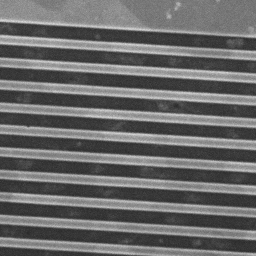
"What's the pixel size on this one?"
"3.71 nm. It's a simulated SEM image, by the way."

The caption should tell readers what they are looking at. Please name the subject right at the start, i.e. parallel lines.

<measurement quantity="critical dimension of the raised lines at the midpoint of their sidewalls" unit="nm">29.6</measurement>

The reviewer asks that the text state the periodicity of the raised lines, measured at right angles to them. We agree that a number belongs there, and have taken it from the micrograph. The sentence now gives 83.1 nm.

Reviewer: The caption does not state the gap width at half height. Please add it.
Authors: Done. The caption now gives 52.7 nm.